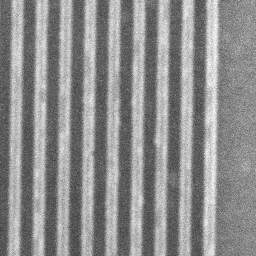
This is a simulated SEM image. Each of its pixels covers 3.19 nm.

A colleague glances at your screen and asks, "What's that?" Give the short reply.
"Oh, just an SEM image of parallel lines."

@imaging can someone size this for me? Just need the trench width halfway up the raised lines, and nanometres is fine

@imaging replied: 46.6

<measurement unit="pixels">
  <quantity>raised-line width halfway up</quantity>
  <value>10.3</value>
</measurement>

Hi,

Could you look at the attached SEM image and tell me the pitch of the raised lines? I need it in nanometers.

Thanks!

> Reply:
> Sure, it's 77.7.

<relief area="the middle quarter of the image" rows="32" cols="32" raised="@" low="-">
@----@@@---@@@---@@@---@@@----@@
@----@@@---@@@---@@@----@@----@@
@----@@@---@@@---@@@---@@@----@@
@----@@@---@@@---@@@---@@@----@@
@----@@@---@@@----@@---@@@----@@
@----@@----@@@----@@---@@@----@@
@----@@----@@-----@@---@@@----@@
@----@@----@@----@@@---@@@----@@
@----@@----@@@---@@@----@@----@@
@----@@----@@@---@@@----@@----@@
@----@@----@@@---@@@----@@----@@
@----@@----@@@---@@@----@@----@@
@----@@----@@@---@@@----@@----@@
@----@@----@@@---@@@----@@----@@
@----@@----@@@---@@@---@@@----@@
@----@@----@@@---@@@---@@@---@@@
@----@@----@@----@@@---@@@---@@@
@----@@----@@----@@@---@@@---@@@
@----@@----@@----@@@---@@@---@@@
@----@@----@@----@@@---@@@---@@@
@----@@----@@----@@@---@@@---@@@
@----@@----@@----@@@---@@@---@@@
@----@@----@@----@@----@@@---@@@
@----@@----@@----@@----@@----@@@
@----@@----@@----@@----@@----@@-
@----@@----@@----@@----@@----@@-
@----@@----@@----@@----@@----@@-
@----@@----@@@---@@----@@@---@@-
@----@@----@@@---@@----@@@---@@-
@----@@----@@----@@----@@----@@-
@----@@----@@----@@----@@----@@-
@----@@----@@----@@----@@----@@-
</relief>